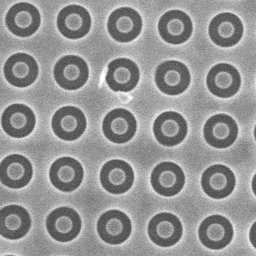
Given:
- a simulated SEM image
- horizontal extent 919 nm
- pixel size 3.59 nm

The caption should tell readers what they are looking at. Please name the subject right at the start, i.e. an array of small figures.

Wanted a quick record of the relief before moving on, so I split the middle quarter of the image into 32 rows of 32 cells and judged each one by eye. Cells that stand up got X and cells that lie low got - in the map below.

-XX---XXXXX--------XXXX--------X
XXX---XXXXX--XXX---XXXX--------X
XXX---XXXXX--XXX---XXX----XXX---
-XX---XXXX---XXX---XXX---XXXX---
------XXXX---XX----XXXX---XXX---
-----XXXXXX-------XXXXX--------X
---XXXXXXXXX-----XXXXXXX-------X
XXXXXXXXXXXXXXXXXXXXXXXXX----XXX
XXXXXXXXXXXXXXXXXXXXXXXXXXXXXXXX
XXXXXXXXXXXXXXXXXXXXXXXXXXXXXXXX
---XXXXXXXXXXXXXXXXXXXXXXXXXXXXX
----XXXXXXXX----XXXXXXXXXXXXXXXX
-----XXXXXX------XXXXXXX-----XXX
XX---XXXXX--------XXXXX-------XX
XXX---XXXX--XXX---XXXX---XXX---X
XXX---XXX---XXXX--XXXX---XXX---X
XX---XXXX---XXXX--XXXX---XXX---X
-----XXXXX--------XXXX---XXX---X
----XXXXXX-------XXXXXX-------XX
XXXXXXXXXXXX----XXXXXXX-------XX
XXXXXXXXXXXXXXXXXXXXXXXXX---XXXX
XXXXXXXXXXXXXXXXXXXXXXXXXXXXXXXX
XXXXXXXXXXXXXXXXXXXXXXXXXXXXXXXX
--XXXXXXXXXXXXXXXXXXXXXXXXXXXXXX
----XXXXXX------XXXXXXXX---XXXXX
-----XXXXX-------XXXXXX------XXX
XX---XXXX---XX---XXXXX--------XX
XX---XXXX--XXXX---XXXX---XX---XX
XX---XXXX--XXXX---XXX---XXXX--XX
-----XXXX---XXX--XXXXX--XXXX--XX
----XXXXX--------XXXXX---XX---XX
---XXXXXXX------XXXXXX-------XXX